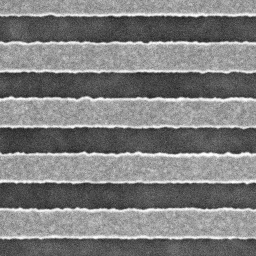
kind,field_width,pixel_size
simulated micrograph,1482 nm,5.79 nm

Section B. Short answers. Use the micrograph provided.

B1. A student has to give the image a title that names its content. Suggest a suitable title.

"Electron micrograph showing lines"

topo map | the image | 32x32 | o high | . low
oooooooooooooooooooooooooooooooo
oooooooooooooooooooooooooooooooo
................................
................................
................................
oooooooooooooooooooooooooooooooo
oooooooooooooooooooooooooooooooo
oooooooooooooooooooooooooooooooo
oooooooooooooooooooooooooooooooo
................................
................................
................................
oooooooooooooooooooooooooooooooo
oooooooooooooooooooooooooooooooo
oooooooooooooooooooooooooooooooo
oooooooooooooooooooooooooooooooo
................................
................................
................................
oooooooooooooooooooooooooooooooo
oooooooooooooooooooooooooooooooo
oooooooooooooooooooooooooooooooo
oooooooooooooooooooooooooooooooo
................................
................................
................................
oooooooooooooooooooooooooooooooo
oooooooooooooooooooooooooooooooo
oooooooooooooooooooooooooooooooo
oooooooooooooooooooooooooooooooo
................................
................................